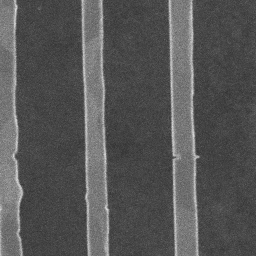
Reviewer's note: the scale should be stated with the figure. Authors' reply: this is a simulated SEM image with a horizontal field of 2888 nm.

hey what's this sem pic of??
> one or a few lines or trenches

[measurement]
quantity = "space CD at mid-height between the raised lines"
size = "767 nm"